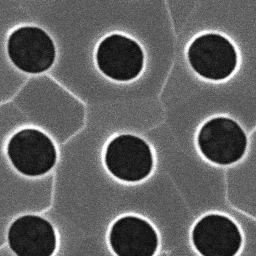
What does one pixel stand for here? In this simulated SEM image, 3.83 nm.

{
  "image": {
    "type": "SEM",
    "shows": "holes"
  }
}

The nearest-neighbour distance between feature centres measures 0.34 micrometres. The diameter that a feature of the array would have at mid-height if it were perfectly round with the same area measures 0.182 um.